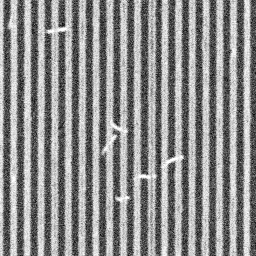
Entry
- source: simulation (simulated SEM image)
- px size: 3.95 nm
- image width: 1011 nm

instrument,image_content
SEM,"parallel lines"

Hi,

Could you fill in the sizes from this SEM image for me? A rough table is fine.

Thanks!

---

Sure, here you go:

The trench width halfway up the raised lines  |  36.1 nanometres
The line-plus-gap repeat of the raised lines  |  54.2 nm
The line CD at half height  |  17.8 nm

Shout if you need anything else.